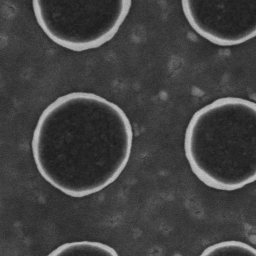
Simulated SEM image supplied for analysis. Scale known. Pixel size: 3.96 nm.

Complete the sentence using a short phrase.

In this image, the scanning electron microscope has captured raised bodies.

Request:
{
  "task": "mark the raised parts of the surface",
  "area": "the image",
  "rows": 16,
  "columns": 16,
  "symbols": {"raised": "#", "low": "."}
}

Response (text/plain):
..######....####
...####.....####
....##.......##.
................
................
................
....###......###
...#####....####
..######....####
..######....####
..######....####
...####......##.
................
................
................
....###......###